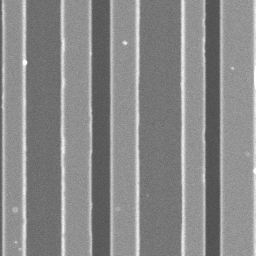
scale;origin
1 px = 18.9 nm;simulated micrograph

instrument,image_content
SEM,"lines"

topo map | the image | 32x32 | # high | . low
###.....###...###......###..####
###.....###...###......###..####
###.....###...###......###..####
###.....###...###......###..####
###.....###...###......###..####
###.....###...###......###..####
###.....###...###......###..####
###.....###...###......###..####
###.....###...###......###..####
###.....###...###......###..####
###.....###...###......###..####
###.....###...###......###..####
###.....###...###......###..####
###.....###...###......###..####
###.....###...###......###..####
###.....###...###......###..####
###.....###...###......###..####
###.....###...###......###..####
###.....###...###......###..####
###.....###...###......###..####
###.....###...###......###..####
###.....###...###......###..####
###.....###...###......###..####
###.....###...###......###..####
###.....###...###......###..####
###.....###...###......###..####
###.....###...###......###..####
###.....###...###......###..####
###.....###...###......###..####
###.....###...###......###..####
###.....###...###......###..####
###.....###...###......###..####